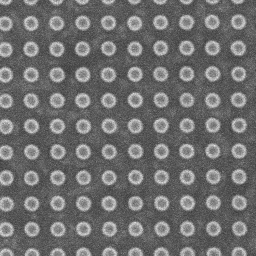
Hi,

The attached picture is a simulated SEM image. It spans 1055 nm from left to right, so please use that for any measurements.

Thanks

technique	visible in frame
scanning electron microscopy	a regular array of raised bodies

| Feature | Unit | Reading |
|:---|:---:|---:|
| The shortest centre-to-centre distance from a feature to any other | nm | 105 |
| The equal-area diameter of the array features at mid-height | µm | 0.055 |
